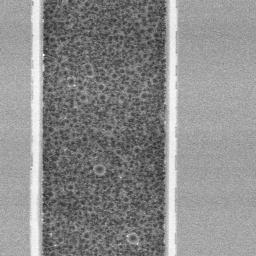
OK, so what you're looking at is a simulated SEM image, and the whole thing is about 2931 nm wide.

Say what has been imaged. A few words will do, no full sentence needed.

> one or a few lines or trenches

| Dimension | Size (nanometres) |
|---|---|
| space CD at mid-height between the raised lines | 1560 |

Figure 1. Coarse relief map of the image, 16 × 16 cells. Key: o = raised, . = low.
oo.........ooooo
oo.........ooooo
oo.........ooooo
oo.........ooooo
oo.........ooooo
oo.........ooooo
oo.........ooooo
oo.........ooooo
oo.........ooooo
oo.........ooooo
oo.........ooooo
oo.........ooooo
oo.........ooooo
oo.........ooooo
oo.........ooooo
oo.........ooooo